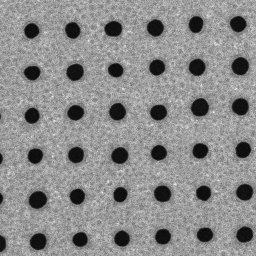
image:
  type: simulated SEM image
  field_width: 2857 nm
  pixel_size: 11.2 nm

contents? a regular array of holes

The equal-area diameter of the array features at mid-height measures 175 nm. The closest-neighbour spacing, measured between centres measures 453 nanometres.